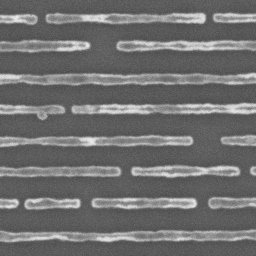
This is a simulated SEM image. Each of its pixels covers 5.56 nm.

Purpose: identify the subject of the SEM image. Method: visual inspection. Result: parallel lines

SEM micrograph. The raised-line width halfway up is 0.0438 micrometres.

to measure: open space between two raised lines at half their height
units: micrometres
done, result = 0.131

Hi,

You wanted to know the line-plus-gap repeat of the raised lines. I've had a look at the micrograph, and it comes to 173 nanometers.